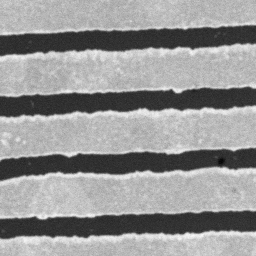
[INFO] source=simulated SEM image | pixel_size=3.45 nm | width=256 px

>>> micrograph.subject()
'lines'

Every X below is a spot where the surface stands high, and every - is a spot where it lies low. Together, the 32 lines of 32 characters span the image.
XXXXXXXXXXXXXXXXXXXXXXXXXXXXXXXX
XXXXXXXXXXXXXXXXXXXXXXXXXXXXXXXX
XXXXXXXXXXXXXXXXXXXXXXXXXXXXXXXX
XXXXXXXXXXXXXXXXXXXXXX----------
--------------------------------
--------------------------------
------------------XXXXXXXXXXXXXX
XXXXXXXXXXXXXXXXXXXXXXXXXXXXXXXX
XXXXXXXXXXXXXXXXXXXXXXXXXXXXXXXX
XXXXXXXXXXXXXXXXXXXXXXXXXXXXXXXX
XXXXXXXXXXXXXXXXXXXXXXXXXXXXXXXX
XXXXXXXXX-XX--------------------
--------------------------------
--------------------------------
--------XXXXXXXXXXXXXXXXXXXXXXXX
XXXXXXXXXXXXXXXXXXXXXXXXXXXXXXXX
XXXXXXXXXXXXXXXXXXXXXXXXXXXXXXXX
XXXXXXXXXXXXXXXXXXXXXXXXXXXXXXXX
XXXXXXXXXXXXXXXXXXXXXXXXXXXXXX--
XXXXX---------------------------
--------------------------------
------------------------XXXXXXXX
--XXXXXXXXXXXXXXXXXXXXXXXXXXXXXX
XXXXXXXXXXXXXXXXXXXXXXXXXXXXXXXX
XXXXXXXXXXXXXXXXXXXXXXXXXXXXXXXX
XXXXXXXXXXXXXXXXXXXXXXXXXXXXXXXX
XXXXXXXXXXXXXXXXXXXXXXX-X-------
--------------------------------
--------------------------------
----------------X-X-X--XXXXXXXXX
XXXXXXXXXXXXXXXXXXXXXXXXXXXXXXXX
XXXXXXXXXXXXXXXXXXXXXXXXXXXXXXXX